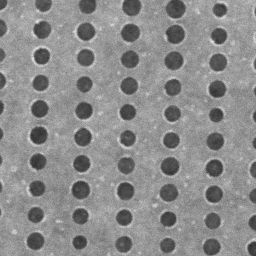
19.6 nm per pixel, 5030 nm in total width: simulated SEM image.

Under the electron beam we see a regular array of holes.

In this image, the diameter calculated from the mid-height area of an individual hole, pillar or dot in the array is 348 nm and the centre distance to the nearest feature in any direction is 516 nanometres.